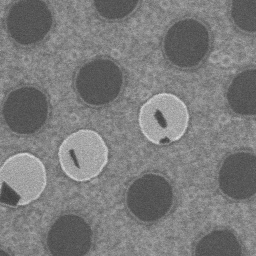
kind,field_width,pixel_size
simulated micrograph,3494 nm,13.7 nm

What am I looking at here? raised bodies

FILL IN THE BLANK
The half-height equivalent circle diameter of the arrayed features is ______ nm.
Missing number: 667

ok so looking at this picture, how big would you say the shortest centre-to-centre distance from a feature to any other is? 1.01 microns